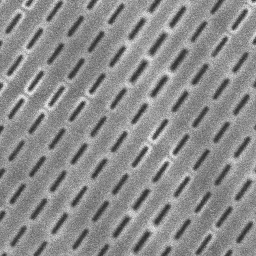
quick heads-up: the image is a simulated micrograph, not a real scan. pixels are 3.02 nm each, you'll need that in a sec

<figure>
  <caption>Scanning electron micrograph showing a regular array of holes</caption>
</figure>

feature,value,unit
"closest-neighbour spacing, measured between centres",77.4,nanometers